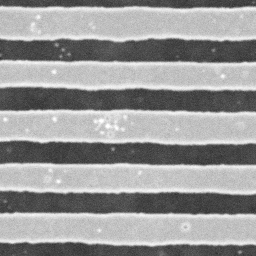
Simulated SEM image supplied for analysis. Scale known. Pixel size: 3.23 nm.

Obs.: lines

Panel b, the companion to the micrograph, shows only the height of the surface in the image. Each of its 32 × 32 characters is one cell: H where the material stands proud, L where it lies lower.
LLLLLLLLLLLLLLLLLLLLLLLLLLLLLLLL
HHHHHHHHHHHHHHHHHHHHHHHHHHHHHHHH
HHHHHHHHHHHHHHHHHHHHHHHHHHHHHHHH
HHHHHHHHHHHHHHHHHHHHHHHHHHHHHHHH
HHHHHHHHHHHHHHHHHHHHHHHHHHHHHHHH
LLLLLLLLLLLLLLLLLLLLLLLLLLLLLLLL
LLLLLLLLLLLLLLLLLLLLLLLLLLLLLLLL
LLLLLLLLLLLLLLLLLLLLLLLLLLLLLLLL
HHHHHHHHHHHHHHHHHHHHHHHHHHHHHHHH
HHHHHHHHHHHHHHHHHHHHHHHHHHHHHHHH
HHHHHHHHHHHHHHHHHHHHHHHHHHHHHHHH
LLLLLLLLLLLLLLLLLLLLLLLLLLLLLLLL
LLLLLLLLLLLLLLLLLLLLLLLLLLLLLLLL
LLLLLLLLLLLLLLLLLLLLLLLLLLLLLLLL
HHHHHHHHHHHHHHHHHHHHHHHHHHHHHHHH
HHHHHHHHHHHHHHHHHHHHHHHHHHHHHHHH
HHHHHHHHHHHHHHHHHHHHHHHHHHHHHHHH
HHLHHHHHHHHHHHHHHHHHHHHHHHHHHHHH
LLLLLLLLLLLLLLLLLLLLLLLLLLLLLLLL
LLLLLLLLLLLLLLLLLLLLLLLLLLLLLLLL
HHHHHHHLLLLLLLHHLLLLLLLLLLLLLLLL
HHHHHHHHHHHHHHHHHHHHHHHHHHHHHHHH
HHHHHHHHHHHHHHHHHHHHHHHHHHHHHHHH
HHHHHHHHHHHHHHHHHHHHHHHHHHHHHHHH
LLLLLLLLLLLLLLLLLLLLLLLLLLLLLLLL
LLLLLLLLLLLLLLLLLLLLLLLLLLLLLLLL
LLLLLLLLLLLLLLLLLLLLLLLLLLLLLLLL
HHHHHHHHHHHHHHHHHHHHHHHHHHHHHHHH
HHHHHHHHHHHHHHHHHHHHHHHHHHHHHHHH
HHHHHHHHHHHHHHHHHHHHHHHHHHHHHHHH
LLLLLLLLLLLLLLHHHHHHHLLHLLHHHHHH
LLLLLLLLLLLLLLLLLLLLLLLLLLLLLLLL